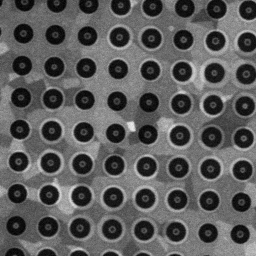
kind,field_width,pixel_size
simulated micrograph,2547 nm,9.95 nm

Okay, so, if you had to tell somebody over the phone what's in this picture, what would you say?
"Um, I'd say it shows an array of small figures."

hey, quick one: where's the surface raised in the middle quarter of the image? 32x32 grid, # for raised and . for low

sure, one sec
###.....###.....###.....###.....
###..#..###..#..###..#..###..#..
###.....###.....###.....###..#..
####..######...#####...####.....
#############################..#
################################
####..##########################
###....####....#####...#####...#
##...#..###.....###.....###.....
###..#..###..#..###..#..##...#..
###....####.....###.....###..#..
####..######..######...####.....
############################...#
################################
####..##########################
###....####...######..######...#
##......###....####....###......
##.....###.....###..#...##......
###....####....####....###......
###...######..#####....####....#
############################...#
################################
###..###########################
##.....####...#####...#####...##
##..#..###.....###.....###.....#
##..#..###..#..###..#..###..#..#
##.....###.....###.....###..#..#
###...#####...####.....###.....#
####################.#######..##
################################
###..###########################
##.....###....####....#####...##